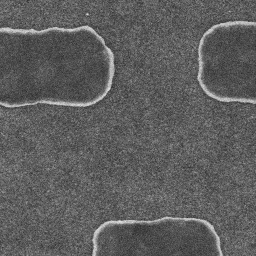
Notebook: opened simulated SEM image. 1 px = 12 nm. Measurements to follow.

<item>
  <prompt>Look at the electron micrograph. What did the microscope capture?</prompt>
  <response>raised bodies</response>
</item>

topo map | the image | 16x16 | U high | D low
DDDDDDDDDDDDDDDD
DDDDDDDDDDDDDDUU
UUUUUUDDDDDDDUUU
UUUUUUUDDDDDUUUU
UUUUUUUDDDDDUUUU
UUUUUUUDDDDDDUUU
UUDDUUDDDDDDDDDD
DDDDDDDDDDDDDDDD
DDDDDDDDDDDDDDDD
DDDDDDDDDDDDDDDD
DDDDDDDDDDDDDDDD
DDDDDDDDDDDDDDDD
DDDDDDDDDDDDDDDD
DDDDDDDDDDDDDDDD
DDDDDDUUUUUUUDDD
DDDDDDUUUUUUUUDD